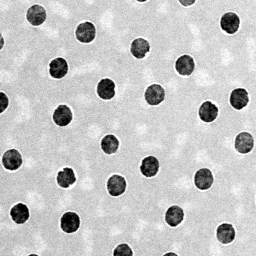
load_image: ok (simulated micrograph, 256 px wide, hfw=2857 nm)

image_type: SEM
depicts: a regular array of holes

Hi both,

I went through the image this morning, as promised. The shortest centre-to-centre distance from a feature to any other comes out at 501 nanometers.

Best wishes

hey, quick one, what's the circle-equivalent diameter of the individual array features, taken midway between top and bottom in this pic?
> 20.5 px